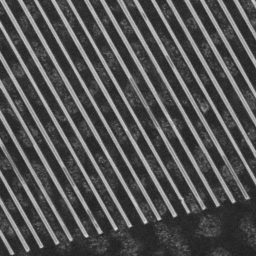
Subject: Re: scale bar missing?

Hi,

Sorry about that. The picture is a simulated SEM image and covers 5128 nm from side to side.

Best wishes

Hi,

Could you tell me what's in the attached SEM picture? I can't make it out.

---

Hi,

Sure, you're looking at parallel lines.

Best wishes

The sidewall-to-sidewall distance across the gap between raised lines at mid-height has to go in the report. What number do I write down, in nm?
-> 240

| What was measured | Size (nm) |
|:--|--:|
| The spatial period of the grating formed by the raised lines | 291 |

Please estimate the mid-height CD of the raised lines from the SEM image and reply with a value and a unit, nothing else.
41.4 nm